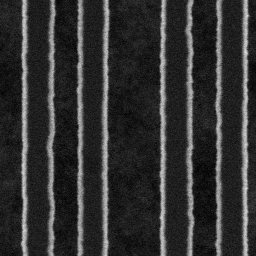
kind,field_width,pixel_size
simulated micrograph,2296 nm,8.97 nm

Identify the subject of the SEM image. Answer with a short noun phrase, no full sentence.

lines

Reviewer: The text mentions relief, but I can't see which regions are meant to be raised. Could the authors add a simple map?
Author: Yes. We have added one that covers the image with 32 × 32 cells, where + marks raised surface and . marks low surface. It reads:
...++++...+++.......++++...++++.
...++++...+++.......++++...++++.
...++++...+++.......++++...++++.
...++++...+++.......++++...++++.
...++++...+++.......++++...++++.
...++++...+++.......++++...++++.
...++++...+++.......++++...++++.
...++++...+++.......++++...++++.
...++++...+++.......++++...++++.
...++++...+++.......++++...++++.
...++++...+++.......++++...++++.
...++++...+++.......++++...++++.
...+++....+++.......++++...++++.
...++++...+++.......++++...++++.
...++++...+++.......++++...++++.
...++++...+++.......++++...++++.
...++++...+++.......++++...++++.
...+++....+++.......++++...++++.
...+++....+++.......++++...++++.
...+++....+++.......++++...++++.
...++++...+++.......++++...++++.
...++++...+++.......++++...++++.
...++++...+++.......++++...++++.
...+++....+++.......++++...++++.
...++++...+++.......++++...++++.
...++++...+++.......++++...++++.
...++++...+++.......++++...++++.
...++++...+++.......++++...++++.
...+++....+++.......++++...++++.
...++++...+++.......++++...++++.
...++++...+++.......++++...++++.
...+++....+++.......++++...++++.